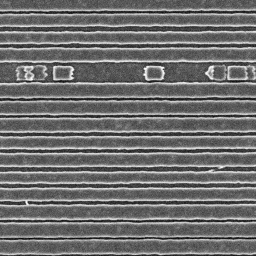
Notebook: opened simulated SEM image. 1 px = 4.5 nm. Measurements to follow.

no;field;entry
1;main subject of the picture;parallel lines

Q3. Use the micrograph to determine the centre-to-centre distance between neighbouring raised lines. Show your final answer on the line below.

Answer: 17.4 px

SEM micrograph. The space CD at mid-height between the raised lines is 3.87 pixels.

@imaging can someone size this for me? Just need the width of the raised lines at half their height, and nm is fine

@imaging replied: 63